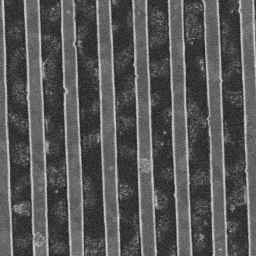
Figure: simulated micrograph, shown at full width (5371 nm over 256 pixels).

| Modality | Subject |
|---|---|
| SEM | parallel lines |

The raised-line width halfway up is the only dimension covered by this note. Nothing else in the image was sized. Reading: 13 pixels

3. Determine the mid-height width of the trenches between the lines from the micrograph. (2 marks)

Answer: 485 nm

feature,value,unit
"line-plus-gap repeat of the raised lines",751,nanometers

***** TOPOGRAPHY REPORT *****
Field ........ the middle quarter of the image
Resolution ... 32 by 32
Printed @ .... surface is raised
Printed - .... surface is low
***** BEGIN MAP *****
@@@------@@@------@@@------@@@--
@@@------@@@------@@@------@@@--
@@@------@@@------@@@------@@@--
@@@------@@@------@@@------@@@--
@@@------@@@------@@@------@@@--
@@@------@@@------@@@------@@@--
@@@------@@@------@@@------@@@--
@@@------@@@------@@@------@@@--
@@@------@@@------@@@------@@@--
@@@------@@@------@@@------@@@--
@@@------@@@------@@@------@@@--
@@@------@@@-------@@------@@@--
@@@------@@@@-----@@@------@@@--
@@@@-----@@@@-----@@@------@@@--
-@@@-----@@@@-----@@@------@@@--
-@@@-----@@@@-----@@@------@@@@-
-@@@-----@@@@-----@@@------@@@@-
-@@@-----@@@@------@@@-----@@@@-
@@@@-----@@@@------@@@-----@@@@-
@@@@------@@@------@@@-----@@@@-
-@@@------@@@------@@@-----@@@@-
-@@@------@@@------@@@-----@@@@-
-@@@------@@@------@@@------@@@-
-@@@------@@@------@@@------@@@-
-@@@------@@@------@@@------@@@-
-@@@------@@@------@@@------@@@-
-@@@------@@@------@@@------@@@-
-@@@------@@@------@@@------@@@-
-@@@------@@@------@@@------@@@-
-@@@------@@@------@@@------@@@-
-@@@------@@@------@@@------@@@-
-@@@------@@@------@@@------@@@-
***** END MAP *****